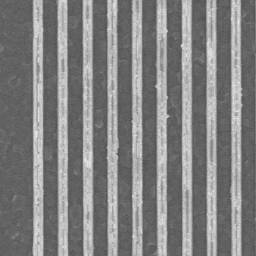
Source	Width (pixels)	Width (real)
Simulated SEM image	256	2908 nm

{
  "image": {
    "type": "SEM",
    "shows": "parallel lines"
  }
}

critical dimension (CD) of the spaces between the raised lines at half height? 0.209 um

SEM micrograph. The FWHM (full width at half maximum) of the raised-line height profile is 0.0696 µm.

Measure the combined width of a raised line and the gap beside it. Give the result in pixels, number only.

24.8